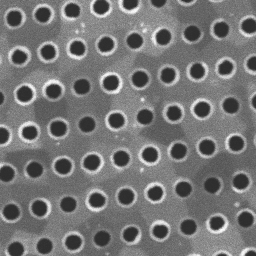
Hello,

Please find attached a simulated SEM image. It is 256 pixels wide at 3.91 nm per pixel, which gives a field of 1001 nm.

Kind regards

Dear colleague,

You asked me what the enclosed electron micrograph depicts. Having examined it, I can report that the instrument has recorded a regular array of holes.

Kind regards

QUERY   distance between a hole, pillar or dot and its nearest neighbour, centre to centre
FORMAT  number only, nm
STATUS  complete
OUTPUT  113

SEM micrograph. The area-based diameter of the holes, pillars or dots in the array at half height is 15.7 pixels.